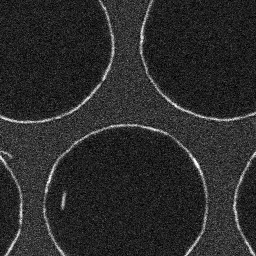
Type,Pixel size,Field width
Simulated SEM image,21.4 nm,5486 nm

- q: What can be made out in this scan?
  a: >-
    raised bodies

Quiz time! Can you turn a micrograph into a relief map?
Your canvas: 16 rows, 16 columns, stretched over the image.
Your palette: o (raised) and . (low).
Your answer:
ooooooo..ooooooo
ooooooo..ooooooo
ooooooo..ooooooo
ooooooo..ooooooo
ooooooo..ooooooo
oooooo....oooooo
ooooo......ooooo
.oo.............
.....oooooo.....
....oooooooo....
o..ooooooooo...o
o..oooooooooo..o
o..oooooooooo..o
o..oooooooooo..o
o..oooooooooo..o
o...oooooooo....